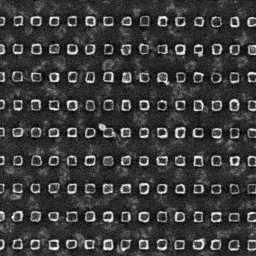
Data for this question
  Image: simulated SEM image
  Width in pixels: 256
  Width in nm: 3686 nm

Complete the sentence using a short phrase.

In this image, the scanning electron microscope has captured a regular array of raised bodies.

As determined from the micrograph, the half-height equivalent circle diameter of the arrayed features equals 0.138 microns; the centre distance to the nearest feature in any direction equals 255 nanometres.